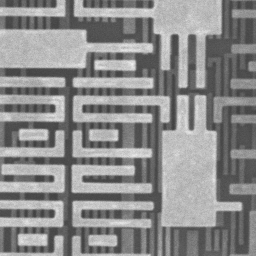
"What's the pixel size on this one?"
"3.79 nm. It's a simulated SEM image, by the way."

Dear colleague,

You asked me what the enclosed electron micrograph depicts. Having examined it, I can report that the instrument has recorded wiring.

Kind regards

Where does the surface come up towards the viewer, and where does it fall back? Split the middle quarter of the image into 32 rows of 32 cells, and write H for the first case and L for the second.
HHHHHLLLHHHHHHHHHHLLLLLLHHLLLHHL
LLLLLLLLLLLLLLLLLLLLLLLLLLLLLHHL
LLLLLLLLLLLLLLLLLLLLLLLLLLLLLHHL
LLLLLLLLLLLLLLLLLLLLLLLLLLLLLHHL
LLHHHHHHHHHHHHHHHHHHHHLLLLLLLHHL
LLHHHHHHHHHHHHHHHHHHHHLLLLLLLHHL
LLLLLLLLLLLLLLLLLLLLLLLLLLLLLLLL
LLLLLLLLLLLLLLLLLLLLLLLLLLLLLLLL
LLHHHHHHHHHHHHHHHHHHHHHHHHLLHHHL
LLHHHHHHHHHHHHHHHHHHHHHHHHLLHHHL
LLHHLLLLLLLLLLLLLLLLLLLLHHLLHHHL
LLHHLLLLLLLLLLLLLLLLLLLLHHLLHHHL
LLHHHHHHHHHLLLHHHHLLLLLLHHLLHHHL
LLHHHHHHHHHHHHHHHHHHHHLLHHLLHHHL
LLLLLLLLLLLLLLLHHHHHHHLLLHLLHHHL
LLLLLLLLLLLLLLLLLLLLLLLLLLLLHHHL
LLLLLLLLLLLLLLLLLLLLLLLLLLLLHHHL
LLHHLLHHHHHHHLLLLLLLLLLLLHHHHHHH
LLHHLLHHHHHHHLLLLLLLLLLLLHHHHHHH
LLHHLLLLLLLLLLLLLLLLLLLLLHHHHHHH
LLHHLLLLLLLLLLLLLLLLLLLLLHHHHHHH
LLHHHHHHHHHHHHHHHHHHHHLLLHHHHHHH
LLHHHHHHHHHHHHHHHHHHHHLLLHHHHHHH
LLLLLLLLLLLLLLLLLLLLLLLLLHHHHHHH
LLLLLLLLLLLLLLLLLLLLLLLLLHHHHHHH
LLHHHHHLLLLLLLLLLLLLLLLLLHHHHHHH
LLHHHHHHHHHHHHHHHHLLLLLLLHHHHHHH
LLHHHHHHHHHHHHHHHLLLLLLLLHHHHHHH
LLHHLLLLLLLLLLLLLLLLLLLLLHHHHHHH
LLHHHLLLLLLLLLLLLLLLLLLLLHHHHHHH
LLHHHHHHHHHHHHHHHHHHHHLLLHHHHHHH
LLHHHHHHHHHHHHHHHHHHHHLLLHHHHHHH